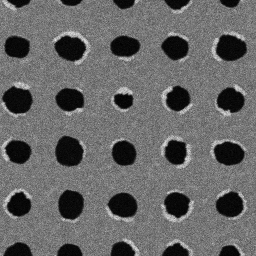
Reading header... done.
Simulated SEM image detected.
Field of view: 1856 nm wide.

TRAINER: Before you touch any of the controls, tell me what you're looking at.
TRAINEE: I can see a regular array of holes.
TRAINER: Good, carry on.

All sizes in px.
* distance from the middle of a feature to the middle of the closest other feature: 51.4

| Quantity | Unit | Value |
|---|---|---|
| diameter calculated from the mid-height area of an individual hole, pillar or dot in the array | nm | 183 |